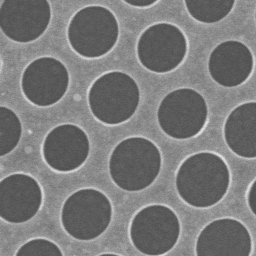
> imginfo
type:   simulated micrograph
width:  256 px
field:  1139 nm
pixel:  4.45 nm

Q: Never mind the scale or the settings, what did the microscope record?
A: a regular array of holes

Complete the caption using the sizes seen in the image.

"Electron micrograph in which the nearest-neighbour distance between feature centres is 308 nm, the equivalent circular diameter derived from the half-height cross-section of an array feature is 226 nm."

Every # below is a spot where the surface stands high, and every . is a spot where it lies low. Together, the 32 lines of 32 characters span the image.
......##########...####......###
......####....##########.....###
......###......##########..#####
......###......###....##########
#....###.......###.....#########
#########.....###......####...##
##########...####......###.....#
####...##########......###......
###.....##########....####.....#
###......####...##########.....#
###......###.....##########...##
###.....###......####....#######
####...####......###......######
.##########......###......###...
..##########....####......###...
...#################......##....
...###....###########....###....
..####.....#####...#########....
..###......###......#########...
#####......###......####...###..
######....####......###.....####
##############......##.......###
....##########.....###.......###
.....##########...####......###.
.....####....##########.....###.
.....###......##########...####.
.....###......###.....##########
#...####......###.....#####..###
########.....###......###......#
#########...####......###......#
###....##########.....###......#
##......##########...####......#